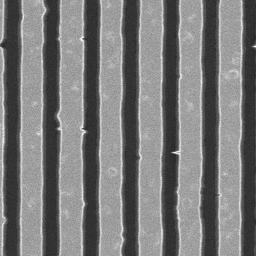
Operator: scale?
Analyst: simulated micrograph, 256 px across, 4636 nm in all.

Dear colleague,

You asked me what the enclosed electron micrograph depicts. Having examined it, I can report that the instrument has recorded parallel lines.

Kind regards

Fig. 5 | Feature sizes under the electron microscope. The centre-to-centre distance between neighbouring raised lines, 39.7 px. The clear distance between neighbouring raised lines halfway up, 272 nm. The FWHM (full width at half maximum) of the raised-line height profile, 450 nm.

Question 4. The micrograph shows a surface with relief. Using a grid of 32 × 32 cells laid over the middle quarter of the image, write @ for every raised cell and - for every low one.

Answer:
@@@@@----@@@@@@----@@@@@@----@@@
@@@@@----@@@@@@----@@@@@@----@@@
@@@@@----@@@@@@----@@@@@@----@@@
@@@@@----@@@@@@----@@@@@@----@@@
@@@@@----@@@@@@----@@@@@@----@@@
@@@@@----@@@@@@----@@@@@@----@@@
@@@@@----@@@@@@----@@@@@@----@@@
@@@@@----@@@@@@----@@@@@@----@@@
@@@@@----@@@@@@----@@@@@@----@@@
@@@@@----@@@@@@----@@@@@@----@@@
@@@@@----@@@@@-----@@@@@@----@@@
@@@@@----@@@@@-----@@@@@@----@@@
@@@@@----@@@@@-----@@@@@@----@@@
@@@@@----@@@@@-----@@@@@@----@@@
@@@@@----@@@@@-----@@@@@@----@@@
@@@@@----@@@@@-----@@@@@@----@@@
@@@@@----@@@@@@----@@@@@@----@@@
@@@@@----@@@@@@----@@@@@@----@@@
@@@@@----@@@@@@----@@@@@@----@@@
@@@@@----@@@@@@----@@@@@@----@@@
@@@@@----@@@@@@----@@@@@@----@@@
@@@@@----@@@@@@----@@@@@@----@@@
@@@@@----@@@@@@----@@@@@@---@@@@
@@@@@----@@@@@@----@@@@@@----@@@
@@@@@----@@@@@@----@@@@@@----@@@
@@@@@----@@@@@@----@@@@@@----@@@
@@@@@----@@@@@@----@@@@@@----@@@
@@@@@----@@@@@@----@@@@@@---@@@@
@@@@@----@@@@@@----@@@@@@---@@@@
@@@@@----@@@@@@----@@@@@@---@@@@
@@@@@----@@@@@@----@@@@@----@@@@
@@@@@----@@@@@@----@@@@@----@@@@